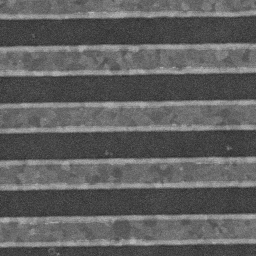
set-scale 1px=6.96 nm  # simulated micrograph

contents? parallel lines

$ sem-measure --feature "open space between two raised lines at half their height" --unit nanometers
226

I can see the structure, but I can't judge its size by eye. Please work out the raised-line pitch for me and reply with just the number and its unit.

0.396 microns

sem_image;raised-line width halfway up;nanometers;172